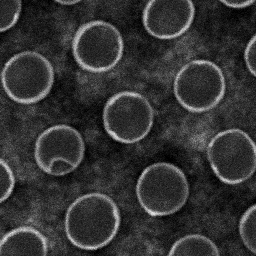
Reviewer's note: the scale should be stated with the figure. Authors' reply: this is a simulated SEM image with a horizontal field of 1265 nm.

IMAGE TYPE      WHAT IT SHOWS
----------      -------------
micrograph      raised bodies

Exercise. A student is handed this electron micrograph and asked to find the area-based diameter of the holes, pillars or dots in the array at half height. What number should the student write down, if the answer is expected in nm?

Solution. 247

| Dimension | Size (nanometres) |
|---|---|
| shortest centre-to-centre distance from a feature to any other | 381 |